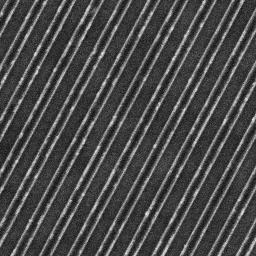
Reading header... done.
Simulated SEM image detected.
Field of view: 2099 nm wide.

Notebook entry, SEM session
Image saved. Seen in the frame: parallel lines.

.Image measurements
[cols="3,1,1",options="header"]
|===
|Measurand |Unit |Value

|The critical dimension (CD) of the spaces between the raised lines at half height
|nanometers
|116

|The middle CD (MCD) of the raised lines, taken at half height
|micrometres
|0.085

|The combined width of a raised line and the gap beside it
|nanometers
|203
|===